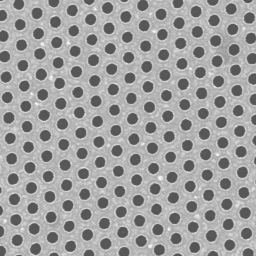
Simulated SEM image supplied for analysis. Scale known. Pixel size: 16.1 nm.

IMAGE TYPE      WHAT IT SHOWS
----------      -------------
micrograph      a regular array of holes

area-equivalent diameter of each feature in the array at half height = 11.6 px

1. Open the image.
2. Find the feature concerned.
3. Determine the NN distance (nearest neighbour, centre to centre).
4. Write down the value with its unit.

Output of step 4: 325 nm